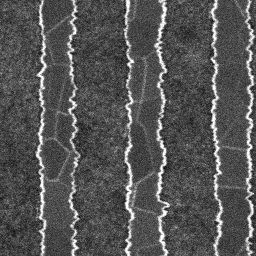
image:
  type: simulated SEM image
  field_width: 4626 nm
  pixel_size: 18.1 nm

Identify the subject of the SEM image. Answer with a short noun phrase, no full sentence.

one or a few lines or trenches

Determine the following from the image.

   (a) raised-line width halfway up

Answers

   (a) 0.596 micrometres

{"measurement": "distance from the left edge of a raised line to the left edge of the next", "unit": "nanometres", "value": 1580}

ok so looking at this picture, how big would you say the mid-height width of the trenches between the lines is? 980 nm